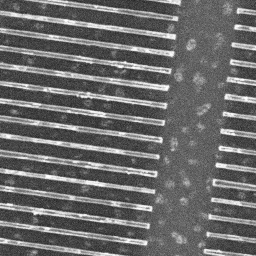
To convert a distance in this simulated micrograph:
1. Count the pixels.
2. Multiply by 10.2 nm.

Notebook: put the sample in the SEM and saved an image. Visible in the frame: parallel lines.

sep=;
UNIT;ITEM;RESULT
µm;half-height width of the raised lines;0.0492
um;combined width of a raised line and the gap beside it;0.177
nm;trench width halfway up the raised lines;130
